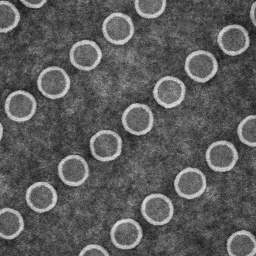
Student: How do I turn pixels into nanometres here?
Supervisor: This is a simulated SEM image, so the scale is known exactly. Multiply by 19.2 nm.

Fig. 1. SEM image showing a regular array of raised bodies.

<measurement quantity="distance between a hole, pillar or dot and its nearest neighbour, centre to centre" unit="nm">785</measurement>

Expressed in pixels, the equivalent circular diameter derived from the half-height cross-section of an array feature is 28.7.